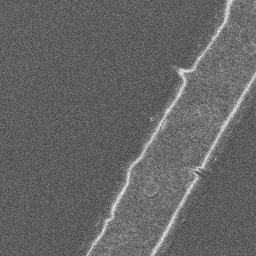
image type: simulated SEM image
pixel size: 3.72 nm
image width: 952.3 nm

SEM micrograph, one or a few lines or trenches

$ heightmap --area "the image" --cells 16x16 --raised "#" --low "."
..............##
..............##
.............###
.............###
............####
...........####.
...........####.
..........####..
..........####..
.........####...
........#####...
........####....
.......####.....
.......####.....
......####......
......####......